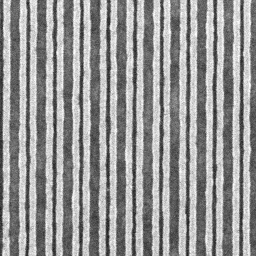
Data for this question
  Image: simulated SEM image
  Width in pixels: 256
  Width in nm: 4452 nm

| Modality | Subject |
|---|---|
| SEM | parallel lines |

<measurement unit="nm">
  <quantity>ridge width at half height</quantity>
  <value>89.1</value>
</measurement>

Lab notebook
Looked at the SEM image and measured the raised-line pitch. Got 0.232 µm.